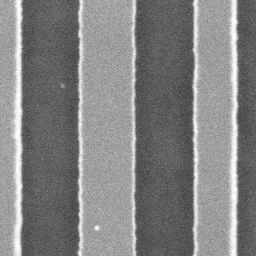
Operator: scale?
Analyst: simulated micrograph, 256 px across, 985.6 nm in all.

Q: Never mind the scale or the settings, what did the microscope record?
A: lines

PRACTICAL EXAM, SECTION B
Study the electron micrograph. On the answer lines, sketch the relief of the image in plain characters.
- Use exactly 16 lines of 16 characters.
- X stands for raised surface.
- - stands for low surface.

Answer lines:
X----XXX----XXX-
X----XXX----XXX-
X----XXX----XXX-
X----XXX----XXX-
X----XXX----XXX-
X----XXX----XXX-
X----XXX----XXX-
X----XXX----XXX-
X----XXX----XXX-
X----XXX----XXX-
X----XXX----XXX-
X----XXX----XXX-
X----XXX----XXX-
X----XXX----XXX-
X----XXX----XXX-
X----XXX----XXX-